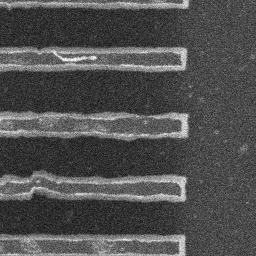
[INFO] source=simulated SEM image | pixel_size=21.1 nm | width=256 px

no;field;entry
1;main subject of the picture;one or a few lines or trenches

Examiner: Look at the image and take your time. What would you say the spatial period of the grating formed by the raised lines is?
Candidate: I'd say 1360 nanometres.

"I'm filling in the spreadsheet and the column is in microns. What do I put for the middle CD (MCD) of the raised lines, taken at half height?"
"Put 0.371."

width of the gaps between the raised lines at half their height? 951 nm